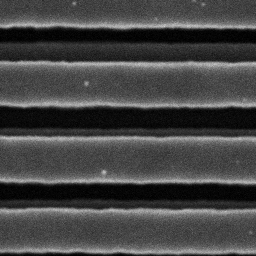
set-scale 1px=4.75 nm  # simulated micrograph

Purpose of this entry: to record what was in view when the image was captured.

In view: lines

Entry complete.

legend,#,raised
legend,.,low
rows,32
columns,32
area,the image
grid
################################
################################
################################
..............###..........#..##
................................
.....#..........................
################################
################################
################################
################################
################################
################################
################################
..................#.............
................................
................................
################################
################################
################################
################################
################################
################################
################################
................................
................................
################################
################################
################################
################################
################################
################################
###.#####.######################